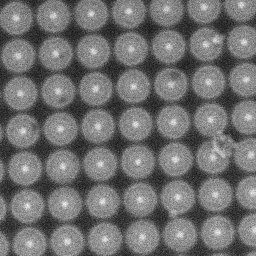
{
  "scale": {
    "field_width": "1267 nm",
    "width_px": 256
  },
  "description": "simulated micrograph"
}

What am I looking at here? an array of small figures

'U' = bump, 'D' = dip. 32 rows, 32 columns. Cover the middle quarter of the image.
UUUUUUUUUUUUUUUUUUUUUUUUUUUUUUUU
UUUUUUUUUUUUUUUUUUUUUUUUUUDUUUUU
UUUUUUUUUUUUUUUUDDDUUUUUDDDDDUUU
UUUUUUDDDDUUUUUDDDDDUUUUDDDDDDUU
DUUUUDDDDDDUUUDDDDDDDUUDDDDDDDUU
DDUUDDDDDDDUUUDDDUDDDUUDDDUDDDUU
DDUUDDDDDDDDUUDDDDDDDUUUDDDDDDUU
DDUUUDDDDDDUUUDDDDDDUUUUDDDDDUUU
DDUUUDDDDDDUUUUDDDDDUUUUUUDDUUUU
DUUUUUUDDUUUUUUUUUUUUUUUUUUUUUUU
UUUUUUUUUUUUUUUUUUUUUUUUUUUUUUUU
UUUUUUUUUUUUUUUUUUUUUUUUUDDDDUUU
UUUUUUUDDDUUUUUDDDDDUUUUDDDDDDUU
DUUUUUDDDDDUUUUDDDDDDUUUDDDDDDDU
DDUUUDDDDDDDUUDDDDDDDUUUDDDUDDDU
DDDUUDDDUDDDUUDDDDDDDDUUDDDDDDDU
DDDUUDDDDDDDUUUDDDDDDUUUDDDDDDUU
DDUUUDDDDDDDUUUDDDDDDUUUUDDDDUUU
DDUUUUDDDDDUUUUUUDDUUUUUUUUUUUUU
DUUUUUUUUUUUUUUUUUUUUUUUUUUUUUUU
UUUUUUUUUUUUUUUUUUUUUUUUUUUDDUUU
UUUUUUUUDDUUUUUUDDDDDUUUUDDDDDUU
DUUUUUUDDDDDUUUDDDDDDDUUUDDDDDDU
DDDUUUDDDDDDUUUDDDDDDDUUDDDDDDDD
DDDUUUDDDDDDDUUDDDUDDDUUDDDDDDDU
DDDUUDDDDDDDDUUDDDDDDDUUUDDDDDDU
DDDUUUDDDDDDUUUUDDDDDUUUUUDDDDUU
DDDUUUDDDDDDUUUUUDDDUUUUUUUDUUUU
DDUUUUUUDDUUUUUUUUUUUUUUUUUUUUUU
UUUUUUUUUUUUUUUUUUUUUUUUUUUUUUUU
UUUUUUUUUUUUUUUUUUDDDUUUUUDDDDDU
DDUUUUUUDDDDUUUUDDDDDDUUUDDDDDDD